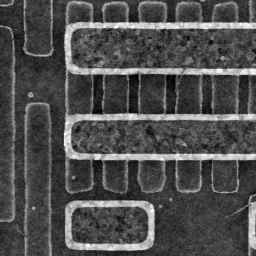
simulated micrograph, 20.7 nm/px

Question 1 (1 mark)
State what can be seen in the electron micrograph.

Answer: wiring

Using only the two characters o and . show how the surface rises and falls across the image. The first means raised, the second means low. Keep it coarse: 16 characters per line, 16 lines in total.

................
................
....oooooooooooo
....oooooooooooo
...........o....
................
................
....oooooooooooo
....oooooooooooo
....oooooooooooo
................
................
................
....ooooo.......
....ooooo.......
................